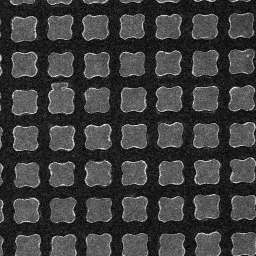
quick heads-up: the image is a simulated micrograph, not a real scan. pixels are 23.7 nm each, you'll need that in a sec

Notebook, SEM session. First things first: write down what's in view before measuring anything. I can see a regular array of raised bodies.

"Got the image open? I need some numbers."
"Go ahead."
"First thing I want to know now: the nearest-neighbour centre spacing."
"35.7 pixels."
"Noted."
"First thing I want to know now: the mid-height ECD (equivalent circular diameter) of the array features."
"0.632 µm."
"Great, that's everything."